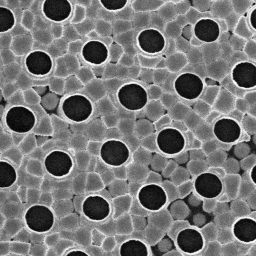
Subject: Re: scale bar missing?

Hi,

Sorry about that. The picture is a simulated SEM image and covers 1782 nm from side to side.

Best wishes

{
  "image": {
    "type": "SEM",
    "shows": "a regular array of holes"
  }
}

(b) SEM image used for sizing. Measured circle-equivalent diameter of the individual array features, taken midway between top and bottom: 0.181 um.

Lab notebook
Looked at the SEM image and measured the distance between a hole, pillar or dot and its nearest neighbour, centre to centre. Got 48.5 px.